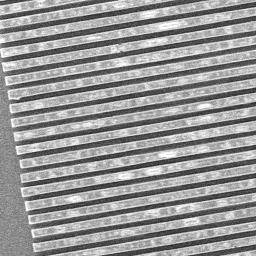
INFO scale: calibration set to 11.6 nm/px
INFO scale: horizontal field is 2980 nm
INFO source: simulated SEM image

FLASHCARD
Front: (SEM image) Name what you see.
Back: parallel lines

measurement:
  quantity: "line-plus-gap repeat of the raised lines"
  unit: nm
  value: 164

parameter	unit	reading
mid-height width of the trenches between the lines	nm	66.1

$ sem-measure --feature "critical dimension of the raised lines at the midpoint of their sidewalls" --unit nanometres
99.2